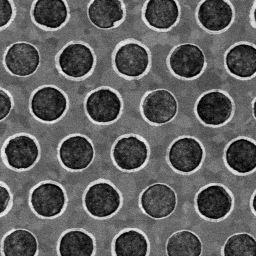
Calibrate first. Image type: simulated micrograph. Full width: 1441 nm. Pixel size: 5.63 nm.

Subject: a regular array of holes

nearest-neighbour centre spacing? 301 nanometers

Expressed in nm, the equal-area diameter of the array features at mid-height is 193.